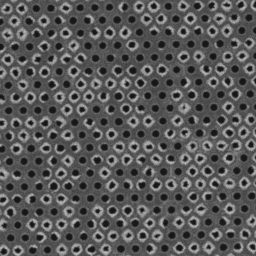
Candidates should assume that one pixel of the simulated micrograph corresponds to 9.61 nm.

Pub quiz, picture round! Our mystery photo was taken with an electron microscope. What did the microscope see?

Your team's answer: a regular array of holes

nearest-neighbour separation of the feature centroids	136	nanometers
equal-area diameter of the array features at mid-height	66.8	nm